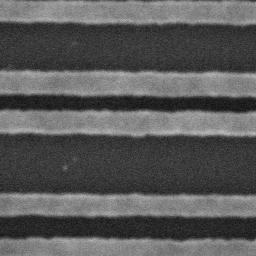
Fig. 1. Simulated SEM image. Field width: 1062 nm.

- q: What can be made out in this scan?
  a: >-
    lines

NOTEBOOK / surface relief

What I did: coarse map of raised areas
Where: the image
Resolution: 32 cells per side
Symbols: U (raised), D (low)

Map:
UUUUUUUUUUUUUUUUUUUUUUUUUUUUUUUU
UUUUUUUUUUUUUUUUUUUUUUUUUUUUUUUU
UUUUUUUUUUUUUUUUUUUUUUUUUUUUUUUU
DDDDDDDDDDDDDDDDDDDDDDDDDDDDDDDD
DDDDDDDDDDDDDDDDDDDDDDDDDDDDDDDD
DDDDDDDDDDDDDDDDDDDDDDDDDDDDDDDD
DDDDDDDDDDDDDDDDDDDDDDDDDDDDDDDD
DDDDDDDDDDDDDDDDDDDDDDDDDDDDDDDD
DDDDDDDDDDDDDDDDDDDDDDDDDDDDDDDD
UUUUUUUUUUUUUUUUUUUUUUUUUUUUUUUU
UUUUUUUUUUUUUUUUUUUUUUUUUUUUUUUU
UUUUUUUUUUUUUUUUUUUUUUUUUUUUUUUU
DDDDDDDDDDDDDDDDDDDDDDDDDDDDDDDD
DDDDDDDDDDDDDDDDDDDDDDDDDDDDDDDD
UUUUUUUUUUUUUUUUUUUUUUUUUUUUUUUU
UUUUUUUUUUUUUUUUUUUUUUUUUUUUUUUU
UUDDUUUUUUUUUUUUUUUUUUUUUUUUUUUU
DDDDDDDDDDDDDDDDDDDDDDDDDDDDDDDD
DDDDDDDDDDDDDDDDDDDDDDDDDDDDDDDD
DDDDDDDDDDDDDDDDDDDDDDDDDDDDDDDD
DDDDDDDDDDDDDDDDDDDDDDDDDDDDDDDD
DDDDDDDDDDDDDDDDDDDDDDDDDDDDDDDD
DDDDDDDDDDDDDDDDDDDDDDDDDDDDDDDD
DDDDDDDDDDDDDDDDDDDDDDDDDDDDDDDD
UUUUUUUUUUUUUDUUUUDDDDUDDDUDDDDD
UUUUUUUUUUUUUUUUUUUUUUUUUUUUUUUU
UUUUUUUUUUUUUUUUUUUUUUUUUUUUUUUU
DDDDDDDDDDDDDDDDDDDDDDDDDDDDDDDD
DDDDDDDDDDDDDDDDDDDDDDDDDDDDDDDD
DDDDDDDDDDDDDDDDDDDDDDDDDDDDDDDD
UUUUUUUUUUUUUUUUUUUUUUUUUUUUUUUU
UUUUUUUUUUUUUUUUUUUUUUUUUUUUUUUU